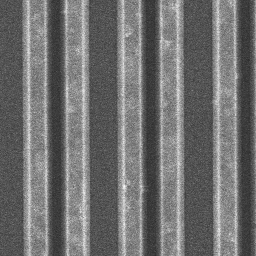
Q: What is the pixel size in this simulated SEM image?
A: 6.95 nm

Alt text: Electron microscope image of parallel lines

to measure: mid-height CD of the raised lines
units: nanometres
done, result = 157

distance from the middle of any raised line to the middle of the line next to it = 329 nm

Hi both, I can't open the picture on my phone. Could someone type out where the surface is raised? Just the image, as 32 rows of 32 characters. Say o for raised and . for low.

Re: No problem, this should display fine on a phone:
...ooo..ooo....ooo..ooo....ooo..
...ooo..ooo....ooo..ooo....ooo..
...ooo..ooo....ooo..ooo....ooo..
...ooo..ooo....ooo..ooo....ooo..
...ooo..ooo....ooo..ooo....ooo..
...ooo..ooo....ooo..ooo....ooo..
...ooo..ooo....ooo..ooo....ooo..
...ooo..ooo....ooo..oo.....ooo..
...ooo..ooo....ooo..ooo....ooo..
...ooo..ooo....ooo..ooo....ooo..
...ooo..ooo....ooo..ooo....ooo..
...ooo..ooo....ooo..ooo....ooo..
...ooo..ooo....ooo..ooo....ooo..
...ooo..ooo....ooo..ooo....ooo..
...ooo..ooo....ooo..ooo....ooo..
...ooo..ooo....ooo..ooo....ooo..
...ooo..ooo....ooo..ooo....ooo..
...ooo..ooo....ooo..ooo....ooo..
...ooo..ooo....ooo..ooo....ooo..
...ooo..ooo....ooo..ooo....ooo..
...ooo..ooo....ooo..ooo....ooo..
...ooo..ooo....ooo..ooo....ooo..
...ooo..ooo....ooo..ooo....ooo..
...ooo..ooo....ooo..ooo....ooo..
...ooo..ooo....ooo..ooo....ooo..
...ooo..ooo....ooo..ooo....ooo..
...ooo..ooo....ooo..ooo....ooo..
...ooo..ooo....ooo..ooo....ooo..
...ooo..ooo....ooo..ooo....ooo..
...ooo..ooo....ooo..ooo....ooo..
...ooo..ooo....ooo..ooo....ooo..
...ooo..ooo....ooo..ooo....ooo..